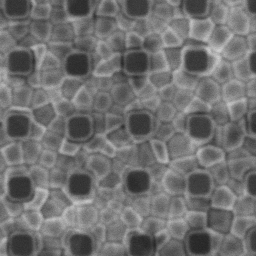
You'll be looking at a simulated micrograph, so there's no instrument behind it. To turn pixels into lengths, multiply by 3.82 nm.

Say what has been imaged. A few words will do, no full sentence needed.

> a regular array of raised bodies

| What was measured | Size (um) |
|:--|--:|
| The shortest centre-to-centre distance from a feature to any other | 0.22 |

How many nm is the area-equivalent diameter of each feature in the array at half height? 103